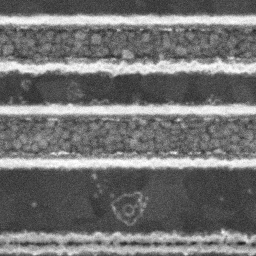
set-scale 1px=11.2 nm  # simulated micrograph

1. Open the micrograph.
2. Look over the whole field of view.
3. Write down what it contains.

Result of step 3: one or a few lines or trenches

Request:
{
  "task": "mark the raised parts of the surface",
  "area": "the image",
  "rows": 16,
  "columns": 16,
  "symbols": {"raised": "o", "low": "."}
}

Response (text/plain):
oooooooooooooooo
................
................
................
oooooooooooooooo
oooooooooooooooo
oooooooooooooooo
................
................
................
oooooooooooooooo
oooooooooooooooo
oooooooooooooooo
oooooooooooooooo
oooooooooooooooo
o....ooo...ooo.o